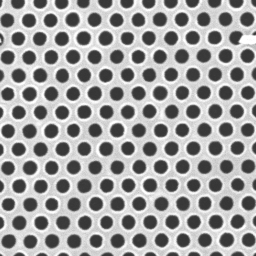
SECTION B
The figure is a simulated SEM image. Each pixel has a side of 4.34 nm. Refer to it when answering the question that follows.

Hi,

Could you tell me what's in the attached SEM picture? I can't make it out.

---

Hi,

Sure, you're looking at a regular array of holes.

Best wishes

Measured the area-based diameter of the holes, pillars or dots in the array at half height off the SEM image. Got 61 nm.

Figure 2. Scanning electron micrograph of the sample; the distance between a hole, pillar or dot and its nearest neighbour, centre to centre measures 91.7 nm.